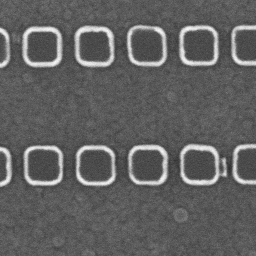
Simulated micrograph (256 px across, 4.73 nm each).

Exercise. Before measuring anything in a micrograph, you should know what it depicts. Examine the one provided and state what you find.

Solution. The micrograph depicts a regular array of raised bodies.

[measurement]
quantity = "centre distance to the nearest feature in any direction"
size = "246 nm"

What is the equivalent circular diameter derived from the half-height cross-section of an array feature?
195 nanometers